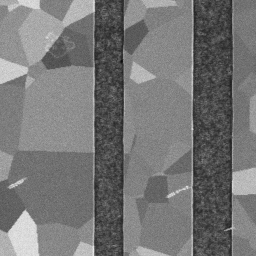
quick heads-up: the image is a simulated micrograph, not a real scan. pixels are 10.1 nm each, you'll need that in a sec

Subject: one or a few lines or trenches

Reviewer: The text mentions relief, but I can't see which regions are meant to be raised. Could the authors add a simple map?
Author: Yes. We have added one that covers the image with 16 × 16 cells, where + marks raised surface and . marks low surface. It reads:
++++++..++++...+
++++++..++++...+
++++++..++++...+
++++++..++++...+
++++++..++++...+
++++++..++++...+
++++++..++++...+
++++++..++++...+
++++++..++++...+
++++++..++++...+
++++++..++++...+
++++++..++++...+
++++++..++++...+
++++++..++++...+
++++++..++++..++
++++++..++++...+